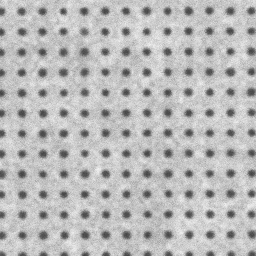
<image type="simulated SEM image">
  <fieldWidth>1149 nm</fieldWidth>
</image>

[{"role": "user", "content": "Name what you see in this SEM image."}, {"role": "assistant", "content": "a regular array of holes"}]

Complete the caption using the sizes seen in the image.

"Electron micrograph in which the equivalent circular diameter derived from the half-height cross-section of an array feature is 36.5 nm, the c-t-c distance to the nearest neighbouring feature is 0.0905 um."